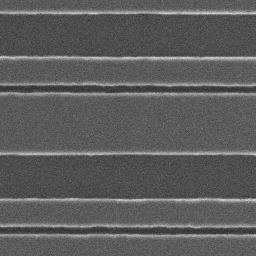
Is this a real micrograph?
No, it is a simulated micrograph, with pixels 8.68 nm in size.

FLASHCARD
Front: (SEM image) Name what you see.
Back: lines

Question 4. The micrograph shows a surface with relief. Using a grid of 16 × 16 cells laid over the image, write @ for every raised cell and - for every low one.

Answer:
@@@@@@@@@@@@@@@@
----------------
----------------
----------------
@@@@@@@@@@@@@@@@
@@@@@@@@@@@@@@@@
@@@@@@@@@@@@@@@@
@@@@@@@@@@@@@@@@
@@@@@@@@@@@@@@@@
@@@@@@@@@@@@@@@@
----------------
----------------
@@@@@@@@@@@@@@--
@@@@@@@@@@@@@@@@
@@@@@@@@@@@@@@@@
@@@@@@@@@@@@@@@@